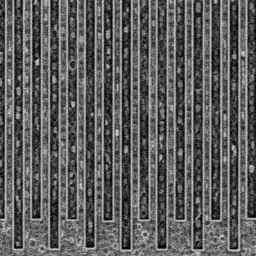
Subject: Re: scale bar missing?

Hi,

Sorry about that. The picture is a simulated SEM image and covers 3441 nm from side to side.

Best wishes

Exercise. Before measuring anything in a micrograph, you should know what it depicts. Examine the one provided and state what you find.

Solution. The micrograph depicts parallel lines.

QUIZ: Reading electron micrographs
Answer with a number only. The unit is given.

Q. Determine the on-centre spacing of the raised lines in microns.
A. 0.241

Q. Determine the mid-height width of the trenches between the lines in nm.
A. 140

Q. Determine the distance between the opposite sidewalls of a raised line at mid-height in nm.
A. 104